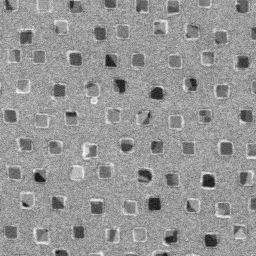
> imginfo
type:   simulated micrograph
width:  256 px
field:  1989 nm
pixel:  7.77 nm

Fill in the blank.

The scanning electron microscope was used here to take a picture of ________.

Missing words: a regular array of raised bodies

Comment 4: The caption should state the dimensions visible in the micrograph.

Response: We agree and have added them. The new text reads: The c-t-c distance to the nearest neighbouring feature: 210 nm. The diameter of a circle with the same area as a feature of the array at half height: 118 nanometers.